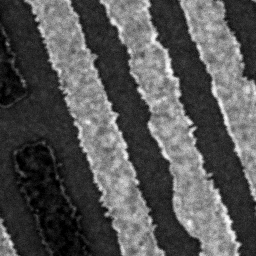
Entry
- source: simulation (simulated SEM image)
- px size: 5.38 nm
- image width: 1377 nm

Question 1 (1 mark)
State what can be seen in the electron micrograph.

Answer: one or a few lines or trenches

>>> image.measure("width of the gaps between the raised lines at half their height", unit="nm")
182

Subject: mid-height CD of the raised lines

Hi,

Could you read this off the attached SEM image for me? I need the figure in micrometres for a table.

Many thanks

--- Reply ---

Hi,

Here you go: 0.194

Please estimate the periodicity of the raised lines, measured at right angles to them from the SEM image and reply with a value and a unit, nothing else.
0.373 microns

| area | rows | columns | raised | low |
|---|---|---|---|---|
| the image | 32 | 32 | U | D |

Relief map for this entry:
DDDDUUUUUDDDDUUUUUUDDDDUUUUUDDDD
DDDDUUUUUDDDDUUUUUDDDDDUUUUUDDDD
DDDDDUUUUUDDDDUUUUUDDDDUUUUUDDDD
DDDDDUUUUUDDDDDUUUUDDDDDUUUUDDDD
UDDDDUUUUUDDDDDUUUUDDDDDUUUUUDDD
UDDDDDUUUUUDDDDDUUUUDDDDDUUUUUDD
UDDDDDUUUUUDDDDDUUUUUDDDDUUUUUDD
UUDDDDUUUUUUDDDDUUUUUDDDDUUUUUDD
UUDDDDDUUUUUDDDDUUUUUDDDDDUUUUDD
UUUDDDDUUUUUDDDDDUUUUUDDDDDUUUDD
UUUDDDDDUUUUUDDDDUUUUUDDDDDUUUUU
UUUDDDDDUUUUUDDDDDUUUUDDDDDUUUUU
UUDDDDDDUUUUUDDDDDUUUUDDDDDUUUUU
DDDDDDDDDUUUUUDDDDDUUUUDDDDDUUUU
DDDDDDDDDUUUUUDDDDDUUUUDDDDDUUUU
DDDDDDDDDDUUUUDDDDDUUUUUDDDDUUUU
DDDDDDDDDDUUUUUDDDDUUUUUDDDDDUUU
DDDDDDDDDDUUUUUDDDDDUUUUDDDDDUUU
DDDUUUDDDDUUUUUUDDDDUUUUDDDDDDUU
DDUUUUUDDDDUUUUUDDDDDUUUUDDDDDUU
DDUUUUUDDDDUUUUUDDDDDUUUUDDDDDUU
DDUUUUUDDDDDUUUUUDDDDUUUUUDDDDDU
DDDUUUUUDDDDUUUUUDDDDDUUUUDDDDDU
DDDUUUUUDDDDDUUUUDDDDDUUUUUDDDDU
DDDUUUUUDDDDDUUUUUDDDDUUUUUDDDDD
DDDDUUUUUDDDDUUUUUDDDDUUUUUUDDDD
DDDDUUUUUDDDDDUUUUUDDDUUUUUUDDDD
DDDDDUUUUUDDDDUUUUUDDDUUUUUUUDDD
DDDDDUUUUUDDDDUUUUUDDDDUUUUUUDDD
UDDDDUUUUUDDDDDUUUUDDDDDUUUUUDDD
UDDDDDUUUUUDDDDUUUUDDDDDDUUUUUDD
UUDDDDUUUUUDDDDUUUUUDDDDDUUUUUDD